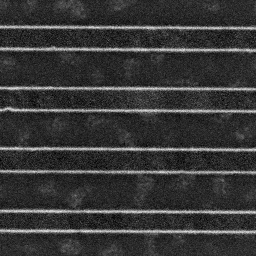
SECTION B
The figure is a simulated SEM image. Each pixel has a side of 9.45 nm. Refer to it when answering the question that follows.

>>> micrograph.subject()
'parallel lines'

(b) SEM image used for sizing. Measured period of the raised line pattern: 0.576 micrometres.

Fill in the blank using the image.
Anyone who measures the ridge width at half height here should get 0.211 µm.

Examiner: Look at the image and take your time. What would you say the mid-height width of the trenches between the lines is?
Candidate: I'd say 39.3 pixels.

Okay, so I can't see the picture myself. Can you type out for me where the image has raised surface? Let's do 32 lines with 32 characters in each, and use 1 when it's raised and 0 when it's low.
00000000000000000000000000000000
00000000000000000000000000000000
00000000000000000000000000000000
11100111111111111110111100000000
11111111111111111111111111111111
11111111111111111111111111111111
00000000000000000000000000000000
00000000000000000000000000000000
00000000000000000000000000000000
00000000000000000000000000000000
00000000000000000000000000000000
11111111111111111111111111111111
11111111111111111111111111111111
11111111111111111111111111111111
00000000000000000000000000000000
00000000000000000000000000000000
00000000000000000000000000000000
00000000000000000000000000000000
00000000000000000000000000000000
11111111111111111111111111111111
11111111111111111111111111111111
00000000000000000000000000001111
00000000000000000000000000000000
00000000000000000000000000000000
00000000000000000000000000000000
00000000000000000000000000000000
11111111111111111111111000000000
11111111111111111111111111111111
11111111111111111111111111111111
00000000000000000000000000000000
00000000000000000000000000000000
00000000000000000000000000000000